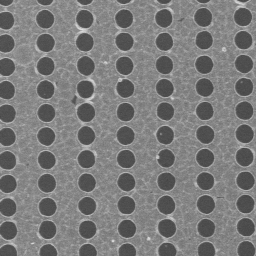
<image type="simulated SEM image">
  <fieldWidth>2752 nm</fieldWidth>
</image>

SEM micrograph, a regular array of holes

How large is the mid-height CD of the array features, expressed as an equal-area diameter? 202 nm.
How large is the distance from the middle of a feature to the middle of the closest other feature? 23.2 px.